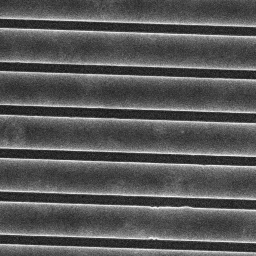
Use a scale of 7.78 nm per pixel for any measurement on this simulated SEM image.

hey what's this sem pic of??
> parallel lines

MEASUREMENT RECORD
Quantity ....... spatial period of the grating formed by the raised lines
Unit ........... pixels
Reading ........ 43.2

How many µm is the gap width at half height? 0.0807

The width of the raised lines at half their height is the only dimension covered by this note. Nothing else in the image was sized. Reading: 250 nanometres